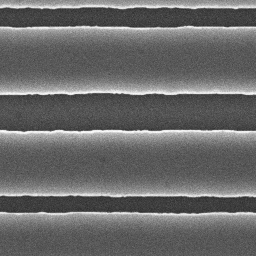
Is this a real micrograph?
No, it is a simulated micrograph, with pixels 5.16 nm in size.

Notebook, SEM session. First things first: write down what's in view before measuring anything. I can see lines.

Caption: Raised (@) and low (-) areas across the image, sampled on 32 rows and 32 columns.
@@@@@@@@@@@@@@@@@@@@@@@@@@@@@@@@
--------------------------------
--------------------------------
@@--@@@@@@@@@@@@------@@@@@@@@@@
@@@@@@@@@@@@@@@@@@@@@@@@@@@@@@@@
@@@@@@@@@@@@@@@@@@@@@@@@@@@@@@@@
@@@@@@@@@@@@@@@@@@@@@@@@@@@@@@@@
@@@@@@@@@@@@@@@@@@@@@@@@@@@@@@@@
@@@@@@@@@@@@@@@@@@@@@@@@@@@@@@@@
@@@@@@@@@@@@@@@@@@@@@@@@@@@@@@@@
@@@@@@@@@@@@@@@@@@@@@@@@@@@@@@@@
@@@@@@@@@@@@@@@@@@@@@@@@@@@@@@@@
--------------------------------
--------------------------------
--------------------------------
--------------------------------
@@@@@@@@@@@@@@@@@@@@@@@@@@@@@@@@
@@@@@@@@@@@@@@@@@@@@@@@@@@@@@@@@
@@@@@@@@@@@@@@@@@@@@@@@@@@@@@@@@
@@@@@@@@@@@@@@@@@@@@@@@@@@@@@@@@
@@@@@@@@@@@@@@@@@@@@@@@@@@@@@@@@
@@@@@@@@@@@@@@@@@@@@@@@@@@@@@@@@
@@@@@@@@@@@@@@@@@@@@@@@@@@@@@@@@
@@@@@@@@@@@@@@@@@@@@@@@@@@@@@@@@
--------------@---------@--@@@-@
--------------------------------
--------------------------------
@@@@@@@@@@@@@@@@@@@@@@@@@@@@@@@@
@@@@@@@@@@@@@@@@@@@@@@@@@@@@@@@@
@@@@@@@@@@@@@@@@@@@@@@@@@@@@@@@@
@@@@@@@@@@@@@@@@@@@@@@@@@@@@@@@@
@@@@@@@@@@@@@@@@@@@@@@@@@@@@@@@@